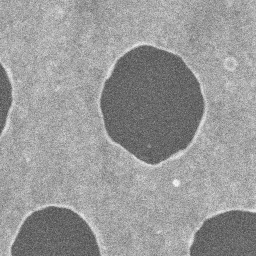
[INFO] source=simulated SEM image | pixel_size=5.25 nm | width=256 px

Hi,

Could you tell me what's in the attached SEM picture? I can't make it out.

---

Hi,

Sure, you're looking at holes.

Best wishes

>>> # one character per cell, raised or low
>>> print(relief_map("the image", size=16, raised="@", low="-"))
@@@@@@@@@@@@@@@@
@@@@@@@@@@@@@@@@
@@@@@@@@@@@@@@@@
@@@@@@@@---@@@@@
@@@@@@@-----@@@@
-@@@@@-------@@@
-@@@@@-------@@@
@@@@@@-------@@@
@@@@@@@-----@@@@
@@@@@@@@---@@@@@
@@@@@@@@@@@@@@@@
@@@@@@@@@@@@@@@@
@@@@@@@@@@@@@@@@
@@---@@@@@@@@---
@-----@@@@@@----
@-----@@@@@@----